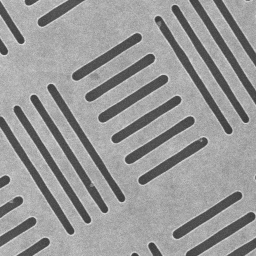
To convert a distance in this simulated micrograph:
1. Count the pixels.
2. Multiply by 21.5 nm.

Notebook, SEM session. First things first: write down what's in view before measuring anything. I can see groups of lines, slits or small figures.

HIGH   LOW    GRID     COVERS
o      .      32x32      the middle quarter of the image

ooooo.....oooooo.....ooooooooo..
ooo.....ooooooo.....oooooooooo..
oo....ooooooo.....ooooooooooooo.
oo...oooooo.....ooooooo...oooooo
oooooooooo.....oooooo.....oooooo
ooooooooo....ooooooo.....ooooooo
ooooooo.....oooooo.....ooooooooo
oooooo....ooooooo.....oooooooooo
ooooo...ooooooo.....ooooooo..ooo
oooooooooooooo....ooooooo....ooo
.ooooooooooo.....ooooooo....oooo
.oooooooooo....ooooooo.....ooooo
..ooooooo.....ooooooo....ooooooo
...ooooo....ooooooo....ooooooo..
o..oooooo.ooooooo.....ooooooo...
oo..oooooooooooo....ooooooo.....
oo...ooooooooo.....ooooooo....oo
ooo..oooooooo....ooooooo.....ooo
oooo..oooooo...ooooooo.....ooooo
.ooo...ooooo..ooooooo....ooooooo
.oooo..oooooooooooo.....ooooooo.
..oooo..oooooooooo....oooooooo..
...ooo...ooooooo.....ooooooo....
o..oooo..oooooo....ooooooo.....o
o...ooo...ooooo...ooooooo....ooo
oo...ooo...oooooooooooo.....oooo
ooo..oooo..ooooooooooo....oooooo
ooo...ooo..ooooooooo.....ooooooo
.ooo..oooo..ooooooo....ooooooooo
.oooo..oooo..oooooo..ooooooooooo
..ooo...ooo...oooooooooooooooooo
..oooo..oooo..oooooooooooooooooo